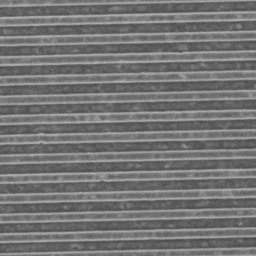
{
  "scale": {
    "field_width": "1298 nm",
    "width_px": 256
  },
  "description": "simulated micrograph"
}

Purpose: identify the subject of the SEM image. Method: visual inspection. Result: parallel lines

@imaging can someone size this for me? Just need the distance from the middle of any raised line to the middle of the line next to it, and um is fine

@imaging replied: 0.0997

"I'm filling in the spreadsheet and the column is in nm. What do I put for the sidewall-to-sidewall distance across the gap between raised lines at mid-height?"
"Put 55.8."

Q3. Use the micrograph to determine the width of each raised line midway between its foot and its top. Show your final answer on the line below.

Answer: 46.3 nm